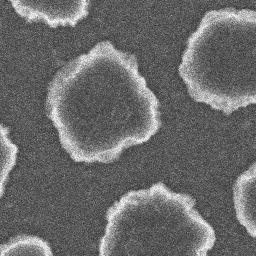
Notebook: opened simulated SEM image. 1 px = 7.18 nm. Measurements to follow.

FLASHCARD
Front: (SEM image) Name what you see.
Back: raised bodies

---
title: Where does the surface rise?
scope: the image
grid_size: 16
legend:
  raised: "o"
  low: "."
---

.oooo...........
.............ooo
............oooo
......o.....oooo
....oooo....oooo
...oooooo...oooo
...ooooooo......
...ooooooo......
....ooooo.......
o....oo.........
o...............
...............o
........ooo....o
.......ooooo...o
.......oooooo...
.oo...ooooooo...